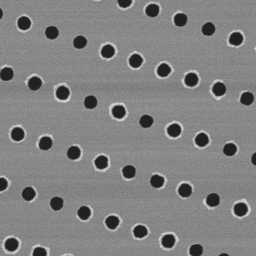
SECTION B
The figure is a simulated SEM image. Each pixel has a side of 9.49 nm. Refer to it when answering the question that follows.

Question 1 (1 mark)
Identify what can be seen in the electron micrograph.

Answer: a regular array of holes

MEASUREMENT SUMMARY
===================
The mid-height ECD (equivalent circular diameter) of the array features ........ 13.7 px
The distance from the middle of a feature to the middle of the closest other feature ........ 279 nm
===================